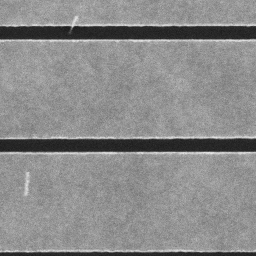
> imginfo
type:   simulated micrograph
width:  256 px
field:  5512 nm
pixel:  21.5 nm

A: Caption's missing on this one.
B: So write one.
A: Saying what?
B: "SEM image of lines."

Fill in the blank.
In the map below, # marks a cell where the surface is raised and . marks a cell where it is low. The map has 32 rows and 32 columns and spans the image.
################################
################################
################################
................................
................................
################################
################################
################################
################################
################################
################################
################################
################################
################################
################################
################################
################################
................................
................................
################################
################################
################################
################################
################################
################################
################################
################################
################################
################################
################################
################################
................................